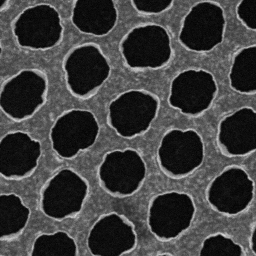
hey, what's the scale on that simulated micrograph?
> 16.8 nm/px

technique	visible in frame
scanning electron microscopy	a regular array of holes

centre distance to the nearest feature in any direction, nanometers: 1040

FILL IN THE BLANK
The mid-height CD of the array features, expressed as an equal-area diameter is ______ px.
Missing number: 45.7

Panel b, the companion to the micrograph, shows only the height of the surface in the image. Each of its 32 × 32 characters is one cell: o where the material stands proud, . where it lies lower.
.oooooooo.....ooo....oooo..ooo..
ooo....oo......ooo..oooo....oo..
oo.....oo......oooooooo.....oo..
oo......oo....ooo...ooo.....ooo.
oo......oooooooo.....o......oooo
ooo....oooooooo......oo....ooooo
ooooooooo....oo......ooooooooo..
oooooooo.....ooo.....oooooooo...
oooooooo......ooooooooooooooo...
oo...oooo....ooooooooo....ooo...
o.....ooo....ooooooooo.....oo...
......ooo...oooo..ooo......ooo.o
......oooooooo.....oo......ooooo
.....ooooooooo......oo....oooooo
o...oooo....oo.....oooooooooo...
ooooooo.....oo.....ooooooooo....
oooooo......ooo...ooo...ooo.....
....oo......oooooooo.....oo.....
.....oo....ooooooooo.....ooo....
.....ooo.oooo....ooo.....ooooooo
.....oooooooo.....oo.....ooooooo
....ooo..ooo......ooo...oooo...o
oooooo....ooo.....ooooooooo....o
oooooo.....oo....ooooooooo......
..ooo......ooooooooo...ooo......
...oo.....ooooooooo.....oo.....o
....oo....ooooooooo.....oooo..oo
...ooooooooo....ooo.....oooooooo
...ooooooooo....ooo....ooooooooo
..ooo....oo......ooo..ooooo.ooo.
oooo.....oo......oooooooo.....o.
oooo......o.....ooooooooo.....oo